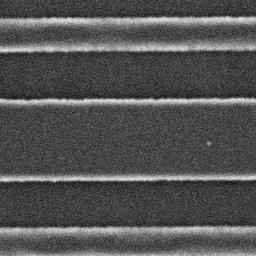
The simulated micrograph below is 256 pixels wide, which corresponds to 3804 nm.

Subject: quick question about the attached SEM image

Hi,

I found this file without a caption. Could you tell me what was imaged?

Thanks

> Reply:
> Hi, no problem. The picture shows lines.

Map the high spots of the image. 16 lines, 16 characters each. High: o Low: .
................
oooooooooooooooo
oooooooooooooooo
................
................
................
oooooooooooooooo
oooooooooooooooo
oooooooooooooooo
oooooooooooooooo
oooooooooooooooo
................
................
................
oooooooooooooooo
oooooooooooooooo